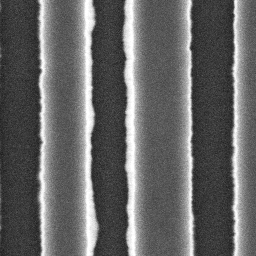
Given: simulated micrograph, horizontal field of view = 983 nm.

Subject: lines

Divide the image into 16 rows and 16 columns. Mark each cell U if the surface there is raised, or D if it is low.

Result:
DDDUUUDDUUUUDDDU
DDDUUUDDUUUUDDDU
DDDUUUDDUUUUDDDU
DDDUUUDDUUUUDDDU
DDDUUUDDUUUUDDDU
DDDUUUDDUUUUDDDU
DDDUUUDDUUUUDDDU
DDDUUUDDUUUUDDDU
DDDUUUDDUUUUDDDU
DDDUUUDDUUUUDDDU
DDDUUUDDUUUUDDDU
DDDUUUDDUUUUDDDU
DDDUUUDDUUUUDDDU
DDDUUUDDUUUUDDDU
DDDUUUDDUUUUDDDU
DDDUUUDDUUUUDDDU